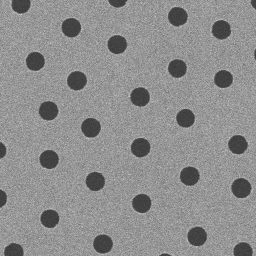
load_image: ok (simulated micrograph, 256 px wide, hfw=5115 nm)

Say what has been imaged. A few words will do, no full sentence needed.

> a regular array of holes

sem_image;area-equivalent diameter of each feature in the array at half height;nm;391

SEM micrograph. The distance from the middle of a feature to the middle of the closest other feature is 958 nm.